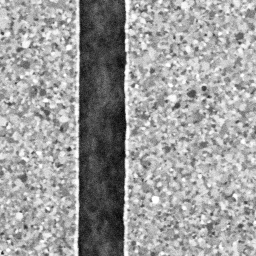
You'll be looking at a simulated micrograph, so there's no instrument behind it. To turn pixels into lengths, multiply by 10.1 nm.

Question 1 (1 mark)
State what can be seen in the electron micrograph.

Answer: one or a few lines or trenches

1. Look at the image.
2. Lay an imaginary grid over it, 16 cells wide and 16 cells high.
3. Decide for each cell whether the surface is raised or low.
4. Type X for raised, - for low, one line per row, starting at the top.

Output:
XXXXX---XXXXXXXX
XXXXX---XXXXXXXX
XXXXX---XXXXXXXX
XXXXX---XXXXXXXX
XXXXX---XXXXXXXX
XXXXX---XXXXXXXX
XXXXX---XXXXXXXX
XXXXX---XXXXXXXX
XXXXX---XXXXXXXX
XXXXX---XXXXXXXX
XXXXX---XXXXXXXX
XXXXX---XXXXXXXX
XXXXX---XXXXXXXX
XXXXX---XXXXXXXX
XXXXX---XXXXXXXX
XXXXX---XXXXXXXX